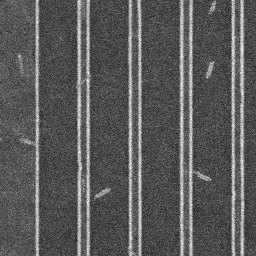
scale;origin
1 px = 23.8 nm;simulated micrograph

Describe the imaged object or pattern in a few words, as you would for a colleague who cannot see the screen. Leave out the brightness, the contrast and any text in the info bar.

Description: parallel lines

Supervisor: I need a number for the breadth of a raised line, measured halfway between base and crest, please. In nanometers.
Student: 211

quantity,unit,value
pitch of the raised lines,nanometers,1220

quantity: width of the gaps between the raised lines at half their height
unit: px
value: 42